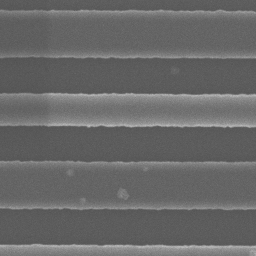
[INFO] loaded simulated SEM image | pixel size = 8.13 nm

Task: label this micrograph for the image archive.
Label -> lines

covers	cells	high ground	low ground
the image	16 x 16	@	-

----------------
@@@@@@@@@@@@@@@@
@@@@@@@@@@@@@@@@
@@@@@@@@@@@@@@@@
----------------
----------------
@@@@@@@@@@@@@@@@
@@@@@@@@@@@@@@@@
----------------
----------------
@@@@@@@@@@@@@@@@
@@@@@@@@@@@@@@@@
@@@@@@@@@@@@@@@@
----------------
----------------
@@@@@@@@@@@@@@@@